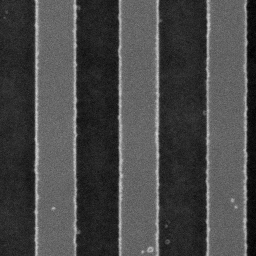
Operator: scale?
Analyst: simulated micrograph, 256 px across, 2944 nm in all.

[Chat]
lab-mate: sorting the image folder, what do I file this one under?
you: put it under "lines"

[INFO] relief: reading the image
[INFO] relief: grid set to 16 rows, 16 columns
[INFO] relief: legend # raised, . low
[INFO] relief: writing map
..###..###...##.
..###..###...##.
..###..###...##.
..###..###...##.
..###..###...##.
..###..###...##.
..###..###...##.
..###..###...##.
..###..###...##.
..###..###...##.
..###..###...##.
..###..###...##.
..###..###...##.
..###..###...##.
..###..###...##.
..###..###...##.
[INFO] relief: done